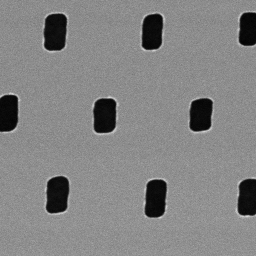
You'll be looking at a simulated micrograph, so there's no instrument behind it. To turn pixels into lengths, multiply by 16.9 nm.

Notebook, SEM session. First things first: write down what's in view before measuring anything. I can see holes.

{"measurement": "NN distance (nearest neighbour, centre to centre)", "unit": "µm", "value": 1.61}